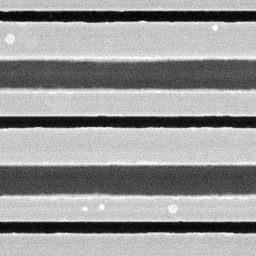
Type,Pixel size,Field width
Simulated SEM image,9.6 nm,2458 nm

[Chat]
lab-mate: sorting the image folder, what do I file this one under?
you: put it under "lines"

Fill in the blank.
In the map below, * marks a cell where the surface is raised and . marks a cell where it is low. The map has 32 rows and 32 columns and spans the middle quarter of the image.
................................
................................
................................
................................
................................
................................
................................
********************************
********************************
********************************
********************************
********************************
********************************
................................
................................
................................
********************************
********************************
********************************
********************************
********************************
********************************
********************************
********************************
********************************
................................
................................
................................
................................
................................
................................
................................